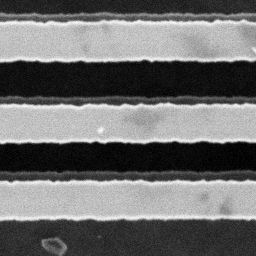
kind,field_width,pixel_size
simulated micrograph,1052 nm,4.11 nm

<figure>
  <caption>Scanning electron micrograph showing lines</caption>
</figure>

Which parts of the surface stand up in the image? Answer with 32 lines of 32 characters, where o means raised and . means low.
................................
................................
................................
oooooooooooooooooooooooooooooooo
oooooooooooooooooooooooooooooooo
oooooooooooooooooooooooooooooooo
oooooooooooooooooooooooooooooooo
oooooooooooooooooooooooooooooooo
................................
................................
................................
................................
................................
oooooooooooooooooooooooooooooooo
oooooooooooooooooooooooooooooooo
oooooooooooooooooooooooooooooooo
oooooooooooooooooooooooooooooooo
oooooooooooooooooooooooooooooooo
................................
................................
................................
................................
................................
oooooooooooooooooooooooooooooooo
oooooooooooooooooooooooooooooooo
oooooooooooooooooooooooooooooooo
oooooooooooooooooooooooooooooooo
o.oo.....o..oo..................
................................
................................
................................
................................